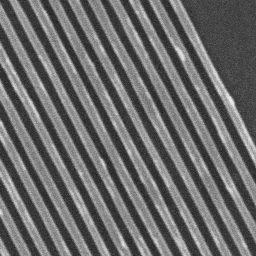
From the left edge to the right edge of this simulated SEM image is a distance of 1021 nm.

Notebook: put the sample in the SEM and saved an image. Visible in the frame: parallel lines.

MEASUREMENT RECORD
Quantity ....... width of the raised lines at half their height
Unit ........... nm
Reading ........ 32.3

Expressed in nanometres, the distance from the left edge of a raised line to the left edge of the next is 71.1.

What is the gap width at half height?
36.3 nm